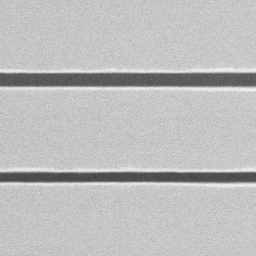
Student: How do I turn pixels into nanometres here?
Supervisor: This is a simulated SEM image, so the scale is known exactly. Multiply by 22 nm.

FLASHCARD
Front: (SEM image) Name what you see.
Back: lines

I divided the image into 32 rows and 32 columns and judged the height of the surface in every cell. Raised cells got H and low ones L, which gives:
HHHHHHHHHHHHHHHHHHHHHHHHHHHHHHHH
HHHHHHHHHHHHHHHHHHHHHHHHHHHHHHHH
HHHHHHHHHHHHHHHHHHHHHHHHHHHHHHHH
HHHHHHHHHHHHHHHHHHHHHHHHHHHHHHHH
HHHHHHHHHHHHHHHHHHHHHHHHHHHHHHHH
HHHHHHHHHHHHHHHHHHHHHHHHHHHHHHHH
HHHHHHHHHHHHHHHHHHHHHHHHHHHHHHHH
HHHHHHHHHHHHHHHHHHHHHHHHHHHHHHHH
HHHHHHHHHHHHHHHHHHHHHHHHHHHHHHHH
LLLLLLLLLLLLLLLLLLLLLLLLLLLLLLLL
LLLLLLLLLLLLLLLLLLLLLLLLLLLLLLLL
HHHHHHHHHHHHHHHHHHHHHHHHHHHHHHHH
HHHHHHHHHHHHHHHHHHHHHHHHHHHHHHHH
HHHHHHHHHHHHHHHHHHHHHHHHHHHHHHHH
HHHHHHHHHHHHHHHHHHHHHHHHHHHHHHHH
HHHHHHHHHHHHHHHHHHHHHHHHHHHHHHHH
HHHHHHHHHHHHHHHHHHHHHHHHHHHHHHHH
HHHHHHHHHHHHHHHHHHHHHHHHHHHHHHHH
HHHHHHHHHHHHHHHHHHHHHHHHHHHHHHHH
HHHHHHHHHHHHHHHHHHHHHHHHHHHHHHHH
HHHHHHHHHHHHHHHHHHHHHHHHHHHHHHHH
LLLLLLLLLLLLLLLLLLLLLLLLLLLLLLLL
LLLLLLLLLLLLLLLLLLLLLLLLLLLLLLLL
HHHHHHHHHHHHHHHHHHHHHHHHHHHHHHHH
HHHHHHHHHHHHHHHHHHHHHHHHHHHHHHHH
HHHHHHHHHHHHHHHHHHHHHHHHHHHHHHHH
HHHHHHHHHHHHHHHHHHHHHHHHHHHHHHHH
HHHHHHHHHHHHHHHHHHHHHHHHHHHHHHHH
HHHHHHHHHHHHHHHHHHHHHHHHHHHHHHHH
HHHHHHHHHHHHHHHHHHHHHHHHHHHHHHHH
HHHHHHHHHHHHHHHHHHHHHHHHHHHHHHHH
HHHHHHHHHHHHHHHHHHHHHHHHHHHHHHHH